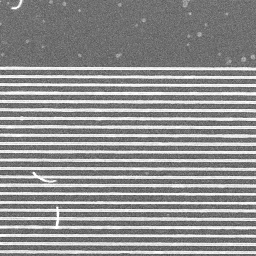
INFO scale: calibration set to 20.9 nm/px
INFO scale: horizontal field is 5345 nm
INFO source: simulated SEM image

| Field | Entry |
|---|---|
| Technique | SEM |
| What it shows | parallel lines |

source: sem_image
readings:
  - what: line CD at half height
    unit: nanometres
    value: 52.2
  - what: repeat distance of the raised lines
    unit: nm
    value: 174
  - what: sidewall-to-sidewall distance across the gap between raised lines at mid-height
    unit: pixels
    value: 6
